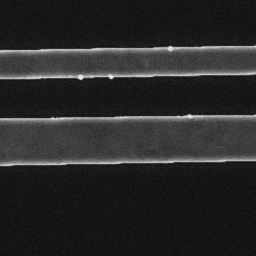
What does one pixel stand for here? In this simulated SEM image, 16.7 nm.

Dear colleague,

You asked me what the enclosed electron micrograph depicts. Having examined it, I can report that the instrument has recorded lines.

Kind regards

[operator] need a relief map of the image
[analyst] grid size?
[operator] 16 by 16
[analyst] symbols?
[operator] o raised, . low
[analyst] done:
................
................
................
oooooooooooooooo
oooooooooooooooo
................
................
oooooooooooooooo
oooooooooooooooo
oooooooooooooooo
................
................
................
................
................
................